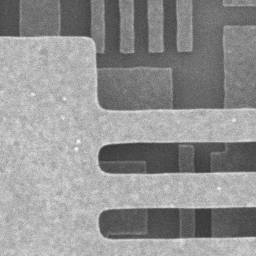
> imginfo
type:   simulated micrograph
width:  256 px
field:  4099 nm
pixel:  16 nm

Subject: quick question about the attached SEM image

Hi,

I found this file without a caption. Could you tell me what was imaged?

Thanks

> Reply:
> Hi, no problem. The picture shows wiring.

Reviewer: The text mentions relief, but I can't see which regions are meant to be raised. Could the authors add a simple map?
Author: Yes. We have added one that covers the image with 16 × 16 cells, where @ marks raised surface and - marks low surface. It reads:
----------------
----------------
@@@@@@----------
@@@@@@----------
@@@@@@----------
@@@@@@----------
@@@@@@----------
@@@@@@@@@@@@@@@@
@@@@@@@@@@@@@@@@
@@@@@@----------
@@@@@@----------
@@@@@@@@@@@@@@@@
@@@@@@@@@@@@@@@@
@@@@@@----------
@@@@@@----------
@@@@@@@@@@@@@@@@